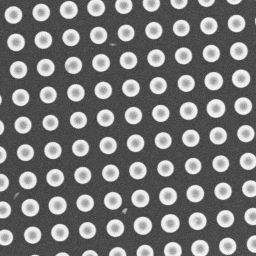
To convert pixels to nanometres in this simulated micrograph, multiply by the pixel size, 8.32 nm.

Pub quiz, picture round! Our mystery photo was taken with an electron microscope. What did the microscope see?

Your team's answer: an array of small figures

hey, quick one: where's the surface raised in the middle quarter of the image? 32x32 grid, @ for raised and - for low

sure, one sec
@@@@---@@@@----@@@----@@--------
-@@@----@@----------------------
--------------------------------
-----------------------@-----@@@
---------------@@@----@@@----@@@
--@@----@@@@---@@@@---@@@@---@@@
-@@@@---@@@@---@@@@---@@@----@@@
-@@@@---@@@@---@@@--------------
-@@@@----@@---------------------
--------------------------------
-----------------------@@----@@@
----------@-----@@@---@@@@---@@@
--@@@----@@@---@@@@---@@@@---@@@
--@@@@--@@@@---@@@@---@@@@----@@
--@@@@---@@@----@@@-------------
--@@@-----@---------------------
--------------------------------
------------------------@@----@@
----------@@----@@@@---@@@@---@@
---@@----@@@@---@@@@---@@@@---@@
--@@@@---@@@@---@@@@---@@@-----@
--@@@@---@@@@----@@-------------
---@@---------------------------
--------------------------------
------------------------@@@----@
-----------@@----@@@---@@@@---@@
---@@@----@@@@--@@@@@---@@@----@
---@@@@---@@@@---@@@----@@@-----
---@@@@---@@@-----@@------------
---@@@--------------------------
--------------------------------
-------------------------@@----@